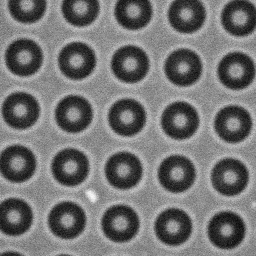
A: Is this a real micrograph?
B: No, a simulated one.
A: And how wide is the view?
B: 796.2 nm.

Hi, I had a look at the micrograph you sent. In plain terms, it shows an array of small figures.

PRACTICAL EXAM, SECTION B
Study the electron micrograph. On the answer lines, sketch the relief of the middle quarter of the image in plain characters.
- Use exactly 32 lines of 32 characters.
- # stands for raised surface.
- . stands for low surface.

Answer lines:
..##....####...###....###....##.
........####....#....####....##.
.......#####.........####.......
......#######.......######......
##############.....########.....
############################...#
################################
################################
.....##########..###############
......#######......########....#
.......#####........######......
.##....####.........#####.......
.###....###....##....###........
.###...####...###....###....##..
.......####....##....###....##..
......#####.........####....##..
.....#######........####........
##.##########......######.......
##########################.....#
################################
################################
....############################
.....#######.....##########..###
......#####........######......#
.#....####.........#####........
###....###....##....####........
###....###...###....###....##...
......####....##....###....###..
......####.........####....##...
.....######........#####........
....########......######........
##############..#########......#